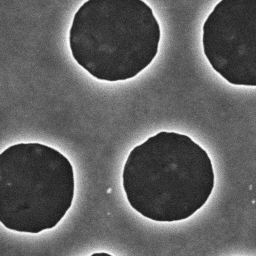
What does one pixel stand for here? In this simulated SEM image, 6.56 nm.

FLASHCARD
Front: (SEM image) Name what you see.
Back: holes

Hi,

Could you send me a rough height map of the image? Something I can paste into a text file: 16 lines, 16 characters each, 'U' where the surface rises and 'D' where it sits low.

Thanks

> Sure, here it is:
UUUUUDDDDUUUUDDD
UUUUDDDDDDUUUDDD
UUUUDDDDDDUUUDDD
UUUUUDDDDDUUUDDD
UUUUUUDDDUUUUUDD
UUUUUUUUUUUUUUUU
UUUUUUUUUUUUUUUU
UUUUUUUUUUUUUUUU
UUUUUUUUUUDDUUUU
DDDDUUUUDDDDDUUU
DDDDDUUUDDDDDUUU
DDDDDUUUDDDDDUUU
DDDDDUUUDDDDDUUU
DDDDUUUUUDDDUUUU
UDUUUUUUUUUUUUUU
UUUUUUUUUUUUUUUU